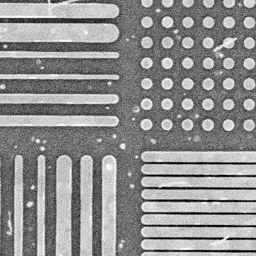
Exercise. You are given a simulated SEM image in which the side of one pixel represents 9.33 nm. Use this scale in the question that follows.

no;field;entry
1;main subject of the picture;groups of lines, slits or small figures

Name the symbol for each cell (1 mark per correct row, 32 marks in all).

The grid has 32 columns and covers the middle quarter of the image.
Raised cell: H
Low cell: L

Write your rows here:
LLLLLLLLLLLLLLLLLLLLHHLLLHHLLLHH
LLLLLLLLLLLLLLLLLLLLLLLLLLLLLLLL
LLLLLLLLLLLLLLLLLLLLLLLLLLLLLLLL
LLLLLLLLLLLHHLLLLLLLLLLLLLLLLLLL
LLLLLLLLLLLLLLLLLLLHHHLLLHHLLLHH
LLLLLLLLLLLLLLLLLLLLHHLLLHHLLLHH
LLLLLLLLLLLLLLLLLLLLLLLLLLLLLLLL
LLLLLLLLLLLLLLLLLLLLLLLLLLLLLLLL
HHHHHHHHHHHHHLLLLLLLLLLLLLLLLLLL
HHHHHHHHHHHHHLLLLLLLHHLLLHHLLLHH
LLLLLLLLLLLLLLLLLLLLHHLLLHHLLLHH
LLLLLLLLLLLLLLLLLLLLLLLLLLLLLLLL
LLLLLLLLLLLLLLLLLLLLLLLLLLLLLLLL
HHHHHHHHHHHHHLLLLLLLLLLLLLLLLLLL
HHHHHHHHHHHHHLLLLLLLHHLLLHHLLLHH
LLLLLLLLLLLLLLLLLLLHHHLLLHHLLLHH
LLLLLLLLLLLLLLLLLLLLLLLLLLLLLLLL
LLLLLLLLLLLLLLLLLLLLLLLLLLLLLLLL
LLLLLLLLLLLLLLLLLLLLLLLLLLLLLLLL
LLLLLLLLLLLLLLLLLLLLLLLLLLLLLLLL
LLLLLLLLLLLLLLLLLLLLLLLLLLLLLLLL
LLLLLLLLLLLLLLLLLLLLLLLLLLLLLLLL
LLLLLLLLLLLLLLLLLLLLHHHHHHHHHHHH
HLLLLHHLLLHHLLLLLLLHHHHHHHHHHHHH
HHLLHHHLLLHHHLLLLLLLLLLLLLLLLLLL
HHLLHHHLLLHHHLLLLLLLHHHHHHHHHHHH
HHLLHHHLLLHHHLLLLLLLHHHHHHHHHHHH
HHLLHHHLLLHHHLLLLLLLHHHHHHHHHHHH
HHLLHHHLLLHHHLLLLLLLHHHHHHHHHHHH
HHLLHHHLLLHHHLLLLLLLHHHHHHHHHHHH
HHLLHHHLLLHHHLLLLLLLHHHHHHHHHHHH
HHLLHHHLLLHHHLLLLLLLHHHHHLLLLLLL